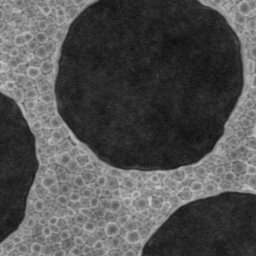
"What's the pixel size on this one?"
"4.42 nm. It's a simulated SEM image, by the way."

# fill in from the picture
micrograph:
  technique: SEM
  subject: holes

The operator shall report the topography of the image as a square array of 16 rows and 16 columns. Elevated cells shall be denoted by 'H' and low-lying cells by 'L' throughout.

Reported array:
HHHHHLLLLLLLLHHH
HHHHLLLLLLLLLLHH
HHHHLLLLLLLLLLLH
HHHHLLLLLLLLLLLH
HHHHLLLLLLLLLLLH
HHHLLLLLLLLLLLLH
LHHHLLLLLLLLLLLH
LLHHLLLLLLLLLLHH
LLHHHLLLLLLLLLHH
LLHHHHLLLLLLLHHH
LLHHHHHLLLLHHHHH
LLHHHHHHHHHHHHHH
LLHHHHHHHHHHLLLL
LLHHHHHHHHHLLLLL
LHHHHHHHHHLLLLLL
HHHHHHHHHLLLLLLL